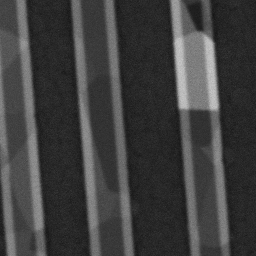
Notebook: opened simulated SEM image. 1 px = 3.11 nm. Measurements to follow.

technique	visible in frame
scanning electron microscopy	one or a few lines or trenches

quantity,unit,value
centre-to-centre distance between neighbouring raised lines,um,0.294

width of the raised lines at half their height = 96.8 nm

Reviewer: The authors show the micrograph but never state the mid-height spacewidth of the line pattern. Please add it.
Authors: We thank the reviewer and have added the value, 185 nanometres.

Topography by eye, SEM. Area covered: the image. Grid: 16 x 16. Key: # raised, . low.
#....##....##...
#....##....##...
##...##....##...
##...##....##...
##...##....##...
##...##....##...
##...##....##...
##...##.....#...
##...###....##..
##...###....##..
##....##....##..
##....##....##..
##....##....##..
##....##....##..
.#....##....##..
.##...##....##..